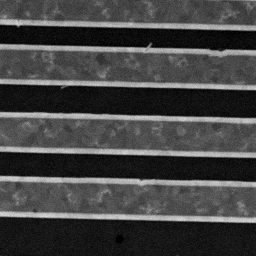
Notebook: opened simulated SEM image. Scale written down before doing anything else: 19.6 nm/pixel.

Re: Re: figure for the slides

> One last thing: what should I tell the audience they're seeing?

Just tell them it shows one or a few lines or trenches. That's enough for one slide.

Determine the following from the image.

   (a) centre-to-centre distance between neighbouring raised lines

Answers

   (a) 1300 nm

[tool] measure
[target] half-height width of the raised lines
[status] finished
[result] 0.706 microns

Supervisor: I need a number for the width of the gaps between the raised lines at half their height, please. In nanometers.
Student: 569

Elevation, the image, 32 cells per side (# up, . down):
################################
################################
################################
................................
................................
................................
###########################.#...
################################
################################
################################
............####################
................................
................................
................................
########........................
################################
################################
################################
################################
................................
................................
................................
########........................
################################
################################
################################
################################
................................
................................
................................
................................
................................